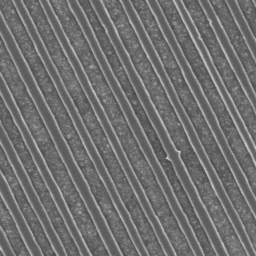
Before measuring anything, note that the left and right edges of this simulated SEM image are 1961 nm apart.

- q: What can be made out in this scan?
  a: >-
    parallel lines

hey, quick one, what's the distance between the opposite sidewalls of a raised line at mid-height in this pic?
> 0.0754 µm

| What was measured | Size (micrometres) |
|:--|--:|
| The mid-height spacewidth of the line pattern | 0.11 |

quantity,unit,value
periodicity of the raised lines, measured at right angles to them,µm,0.185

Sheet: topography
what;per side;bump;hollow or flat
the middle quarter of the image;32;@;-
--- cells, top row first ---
--@@@----@@@---@@-----@@@----@@-
--@@@----@@@---@@@-----@@----@@@
---@@-----@@@---@@-----@@@----@@
---@@@----@@@---@@@-----@@----@@
----@@-----@@@---@@-----@@@----@
----@@@----@@@---@@@-----@@----@
@----@@-----@@@---@@-----@@@----
@----@@@----@@@---@@@-----@@----
@@----@@-----@@@---@@-----@@----
@@----@@@-----@@---@@@-----@@---
@@@----@@-----@@@---@@@----@@---
-@@----@@@----@@@---@@@-----@@--
-@@@----@@@----@@@---@@@----@@--
--@@----@@@----@@@---@@@-----@@-
--@@@----@@-----@@@---@@@----@@@
---@@----@@@----@@@---@@@-----@@
---@@@----@@-----@@@---@@@----@@
----@@----@@@----@@@---@@@-----@
----@@@----@@-----@@@---@@@----@
@----@@----@@@----@@@---@@@-----
@----@@@----@@-----@@@---@@@----
@@----@@----@@@----@@@---@@@----
@@----@@@----@@-----@@@---@@@---
@@-----@@----@@@-----@@---@@@---
@@@----@@@----@@-----@@@---@@@--
@@@-----@@----@@@-----@@---@@@--
-@@@----@@@----@@-----@@@---@@@-
-@@@@----@@----@@@-----@@---@@@-
--@@@----@@@----@@-----@@@---@@@
--@@@@----@@----@@@----@@@---@@@
---@@@----@@@----@@-----@@@---@@
---@@@-----@@----@@@-----@@---@@